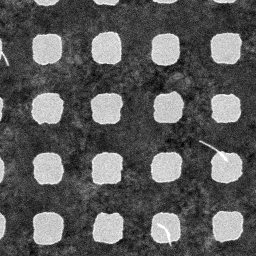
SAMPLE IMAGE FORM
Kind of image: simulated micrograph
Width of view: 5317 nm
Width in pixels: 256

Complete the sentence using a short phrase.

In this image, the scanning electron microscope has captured a regular array of raised bodies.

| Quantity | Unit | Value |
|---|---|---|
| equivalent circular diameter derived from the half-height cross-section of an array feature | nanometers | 649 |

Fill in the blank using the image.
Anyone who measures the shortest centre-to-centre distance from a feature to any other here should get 1220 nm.